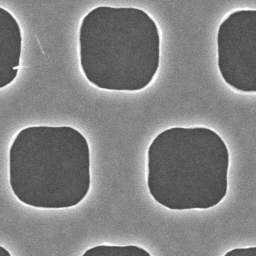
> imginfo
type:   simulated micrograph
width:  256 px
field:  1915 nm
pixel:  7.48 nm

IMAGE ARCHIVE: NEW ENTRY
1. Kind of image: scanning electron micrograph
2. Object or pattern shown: holes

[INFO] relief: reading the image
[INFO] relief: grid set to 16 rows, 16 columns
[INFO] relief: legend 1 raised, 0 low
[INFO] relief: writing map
1111110011111111
0111100000111100
0111100000111100
0111100000111100
0111100000111100
1111110001111110
1111111111111111
1111111111111111
1000011111000011
1000001110000011
1000001110000011
1000001110000011
1000011111000011
1111111111111111
1111111111111111
1111110001111110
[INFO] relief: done